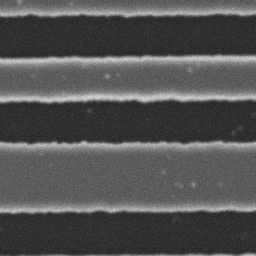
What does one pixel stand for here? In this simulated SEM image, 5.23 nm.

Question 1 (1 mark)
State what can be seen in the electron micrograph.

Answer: lines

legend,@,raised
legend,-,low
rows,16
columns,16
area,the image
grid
@@@@@@@@@@@@@@@@
----------------
----------------
-----------@@@@@
@@@@@@@@@@@@@@@@
@@@@@@@@@@@@@@@@
----------------
----------------
----------------
@@@@@@@@@@@@@@@@
@@@@@@@@@@@@@@@@
@@@@@@@@@@@@@@@@
@@@@@@@@@@@@@@@@
----------------
----------------
----------------